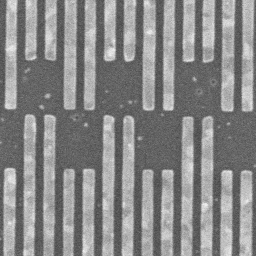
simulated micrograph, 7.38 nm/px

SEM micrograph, wiring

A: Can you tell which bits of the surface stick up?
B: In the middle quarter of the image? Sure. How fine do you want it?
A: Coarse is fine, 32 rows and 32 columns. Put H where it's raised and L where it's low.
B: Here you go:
HHHLLHHLLLLLLLLLLLLLHHLLLHHLLLLL
HHHLLHHLLLLLLLLLLLLLHHLLLHHLLLLL
HHHLLHHLLLLLLLLLLLLLHHLLLHHLLLLL
HHHLLHHLLLLLLLLLLLLLHHLLLHHLLLLL
HHHLLHHLLLLLLLLLLLLLHHLLLHHLLLLL
HHHLLHHLLLLLLLLLLLLLHHLLLHHLLLLL
HHHLLHHLLLLLLLLLLLLLHHLLLHHLLLLL
HHHLLHHLLLLLLLLLLLLLHHLLLHHLLLLL
HHHLLHHLLLLLLLLLLLLLHHLLLHHLLLLL
HHHLLHHLLLLLLLLLLLLLHHLLLHHLLLLL
HHHLLHHLLLLLLLLLLLLLHHLLLHHLLLLL
LLLLLLLLLLLLLLLLLLLLLLLLLLLLLLLL
LLLLLLLLLLLLLLLLLLLLLLLLLLLLLLLL
LLLLLLLLLLHHLLLHHLLLLLLLLLLLLLHH
LLLLLLLLLLHHLLLHHLLLLLLLLLLLLLHH
LLLLLLLLLLHHLLLHHLLLLLLLLLLLLLHH
LLLLLLLLLLHHLLLHHLLLLLLLLLLLLLHH
LLLLLLLLLLHHLLLHHLLLLLLLLLLLLLHH
LLLLLLLLLLHHLLLHHLLLLLLLLLLLLLHH
LLLLLLLLLLHHLLLHHLLLLLLLLLLLLLHH
LLLLLLLLLLHHLLLHHLLLLLLLLLLLLLHH
LLLLLLLLLLHHLLLHHLLLLLLLLLLLLLHH
LLLLLLLLLLHHLLLHHLLLLLLLLLLLLLHH
LLLLLLLLLLHHLLLHHLLLLLLLLLLLLLHH
LLLLLLLLLLHHLLLHHLLLLLLLLLLLLLHH
LLLLLLLLLLHHLLLHHLLLLLLLLLLLLLHH
LHLLLHHLLLHHLLLHHLLLLLLLLLLLLLHH
HHLLLHHLLLHHLLLHHLLLHHLLLHHLLLHH
HHLLLHHLLLHHLLLHHLLLHHLLLHHLLLHH
HHLLLHHLLLHHLLLHHLLLHHLLLHHLLLHH
HHLLLHHLLLHHLLLHHLLLHHLLLHHLLLHH
HHLLLHHLLLHHLLLHHLLLHHLLLHHLLLHH